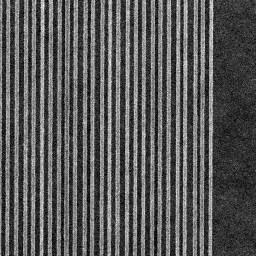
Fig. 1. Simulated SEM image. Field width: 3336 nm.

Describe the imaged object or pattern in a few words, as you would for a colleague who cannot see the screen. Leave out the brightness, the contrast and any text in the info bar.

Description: parallel lines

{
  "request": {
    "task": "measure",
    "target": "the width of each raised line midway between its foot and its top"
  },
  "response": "3.5 pixels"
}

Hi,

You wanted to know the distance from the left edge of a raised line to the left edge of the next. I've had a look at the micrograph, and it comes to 110 nm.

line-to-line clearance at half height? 68.4 nanometers